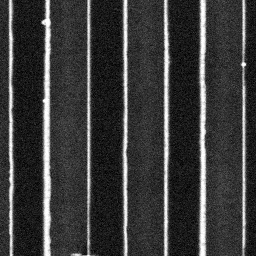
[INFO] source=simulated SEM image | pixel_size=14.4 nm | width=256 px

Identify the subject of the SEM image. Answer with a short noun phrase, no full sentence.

lines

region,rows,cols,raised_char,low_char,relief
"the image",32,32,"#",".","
.#####.....#####.....#####....##
.#####.....#####.....#####....##
.#####.....#####.....#####....##
.#####.....#####.....#####....##
.#####.....#####.....#####....##
.#####.....#####.....#####....##
.#####.....#####.....#####....##
.#####.....#####.....####.....##
.#####.....#####.....####.....##
.#####.....#####.....####.....##
.#####.....#####.....#####....##
.#####.....#####.....#####....##
.#####.....#####.....#####....##
.#####.....#####.....#####....##
.#####.....#####.....#####....##
.#####.....#####.....#####....##
.#####.....#####.....#####....##
.#####.....#####.....####.....##
.#####.....#####.....#####....##
.#####.....#####.....#####....##
.#####.....#####.....#####....##
.#####.....#####.....#####....##
.#####.....#####.....#####....##
.#####.....#####.....#####....##
.#####.....#####.....#####....##
.#####.....#####.....#####....##
.#####.....#####.....#####....##
.#####.....#####.....#####....##
.#####.....#####.....#####....##
.#####.....#####.....#####....##
.#####.....#####.....#####....##
.#####.....#####.....#####....##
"